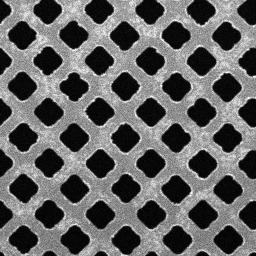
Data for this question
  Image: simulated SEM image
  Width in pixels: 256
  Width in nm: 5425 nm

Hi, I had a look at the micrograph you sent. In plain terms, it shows a regular array of holes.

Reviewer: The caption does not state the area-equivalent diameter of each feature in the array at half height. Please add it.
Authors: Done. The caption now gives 0.565 micrometres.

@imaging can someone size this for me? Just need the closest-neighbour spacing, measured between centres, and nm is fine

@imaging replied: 756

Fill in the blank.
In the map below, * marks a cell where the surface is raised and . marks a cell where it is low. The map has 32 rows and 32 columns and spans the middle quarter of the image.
******......******.......******.
*******....*********....********
*...****..****..*****..****..***
*...*********....*********....**
......******......*******......*
......******.......*****........
......******.......******.......
.....********.....********.....*
*...****..****...****.*****...**
*******....*********...*********
******......*******.....********
*****.......******.......******.
*****........*****.......******.
******......*******......******.
*******....*********....********
*...****.*****...****.*****..***
.....********....*********....**
......******.......******......*
......******.......*****........
......******.......******......*
.....********.....********....**
**..****..****...****..****...**
*******....*********....********
******......*******......*******
******.......*****.......******.
*****........*****.......******.
******......*******......*******
*******....****.****....********
*...****..****...****.*****..***
.....********.....********....**
......******.......*****.......*
......******.......*****........